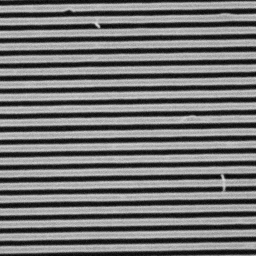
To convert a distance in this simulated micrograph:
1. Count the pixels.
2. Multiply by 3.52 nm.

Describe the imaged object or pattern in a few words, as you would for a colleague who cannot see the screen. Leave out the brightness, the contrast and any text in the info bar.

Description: parallel lines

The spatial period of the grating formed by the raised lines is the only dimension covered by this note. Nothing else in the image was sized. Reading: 44.6 nanometers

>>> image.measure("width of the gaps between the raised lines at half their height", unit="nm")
19.4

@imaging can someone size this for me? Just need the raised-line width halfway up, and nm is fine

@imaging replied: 22.9